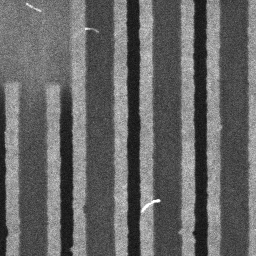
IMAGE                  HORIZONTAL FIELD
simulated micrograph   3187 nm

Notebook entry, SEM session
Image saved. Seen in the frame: parallel lines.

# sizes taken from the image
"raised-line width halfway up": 179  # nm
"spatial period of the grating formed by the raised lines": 418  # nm